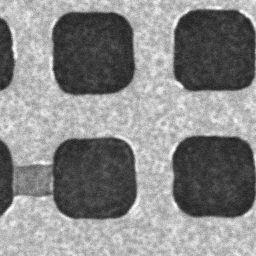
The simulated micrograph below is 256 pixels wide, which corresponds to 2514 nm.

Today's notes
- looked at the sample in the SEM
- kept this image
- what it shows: holes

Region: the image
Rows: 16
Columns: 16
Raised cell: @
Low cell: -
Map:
@@@@@@@@@@@@@@@@
@@@-----@@@-----
-@@-----@@@-----
-@@-----@@@-----
-@@-----@@@-----
@@@@----@@@@---@
@@@@@@@@@@@@@@@@
@@@@@@@@@@@@@@@@
@@@@@@@@@@@@--@@
-@@-----@@@-----
---------@@-----
---------@@-----
-@@-----@@@-----
@@@@----@@@@---@
@@@@@@@@@@@@@@@@
@@@@@@@@@@@@@@@@